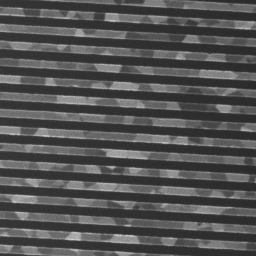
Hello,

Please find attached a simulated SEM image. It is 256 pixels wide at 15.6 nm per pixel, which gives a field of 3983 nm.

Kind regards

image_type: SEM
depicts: parallel lines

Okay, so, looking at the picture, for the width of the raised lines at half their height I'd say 0.12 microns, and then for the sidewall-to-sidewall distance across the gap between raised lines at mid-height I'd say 144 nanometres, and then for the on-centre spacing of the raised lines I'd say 0.264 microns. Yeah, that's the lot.